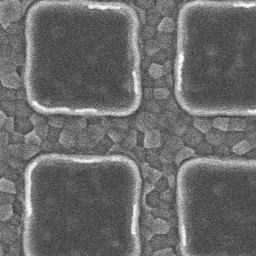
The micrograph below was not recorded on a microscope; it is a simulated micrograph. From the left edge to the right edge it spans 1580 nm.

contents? raised bodies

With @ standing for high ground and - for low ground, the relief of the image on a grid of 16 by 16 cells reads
@-@@@@@@----@@@@
--@@@@@@---@@@@@
--@@@@@@---@@@@@
--@@@@@@@--@@@@@
--@@@@@@@--@@@@@
--@@@@@@@--@@@@@
--@@@@@@@--@@@@@
----------------
----------------
----------------
--@@@@@@----@@@@
--@@@@@@@--@@@@@
--@@@@@@@--@@@@@
--@@@@@@@--@@@@@
--@@@@@@@--@@@@@
--@@@@@@@--@@@@@